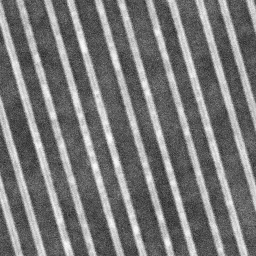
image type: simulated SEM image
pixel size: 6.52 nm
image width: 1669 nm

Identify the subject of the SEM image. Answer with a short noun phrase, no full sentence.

parallel lines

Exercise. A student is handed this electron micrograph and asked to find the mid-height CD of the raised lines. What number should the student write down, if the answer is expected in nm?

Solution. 32.1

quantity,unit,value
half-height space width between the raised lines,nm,110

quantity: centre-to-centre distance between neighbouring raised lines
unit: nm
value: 158